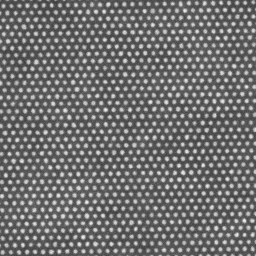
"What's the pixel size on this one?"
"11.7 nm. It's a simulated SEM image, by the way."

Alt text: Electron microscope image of a regular array of raised bodies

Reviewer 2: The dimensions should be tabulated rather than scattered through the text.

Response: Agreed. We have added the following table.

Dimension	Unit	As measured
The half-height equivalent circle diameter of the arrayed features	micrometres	0.0439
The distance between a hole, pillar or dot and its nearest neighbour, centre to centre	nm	89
